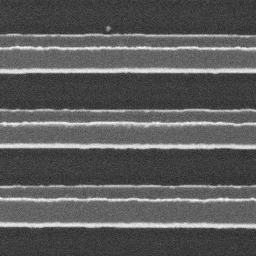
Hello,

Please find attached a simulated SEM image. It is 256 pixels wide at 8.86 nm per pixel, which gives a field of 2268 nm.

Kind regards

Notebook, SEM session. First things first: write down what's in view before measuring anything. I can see lines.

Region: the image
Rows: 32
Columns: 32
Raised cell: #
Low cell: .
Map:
................................
................................
................................
................................
########.##########.............
################################
################################
################################
################################
................................
................................
................................
................................
................................
################################
################################
################################
################################
..............................##
................................
................................
................................
................................
################################
################################
################################
################################
################################
................................
................................
................................
................................